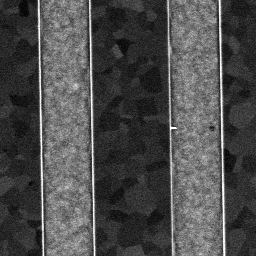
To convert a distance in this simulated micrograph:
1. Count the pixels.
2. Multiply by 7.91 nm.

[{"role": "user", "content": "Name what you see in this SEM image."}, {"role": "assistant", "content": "one or a few lines or trenches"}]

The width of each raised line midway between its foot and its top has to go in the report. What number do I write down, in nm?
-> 620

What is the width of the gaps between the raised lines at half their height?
406 nm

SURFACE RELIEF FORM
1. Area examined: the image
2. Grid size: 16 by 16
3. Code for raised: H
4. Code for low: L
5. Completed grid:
HHLLLLHHHHLLLLHH
HHLLLLHHHHHLLLHH
HHLLLLHHHHHLLLHH
HHLLLLHHHHHLLLHH
HHHLLLHHHHHLLLHH
HHHLLLHHHHHLLLHH
HHHLLLHHHHHLLLHH
HHHLLLHHHHHLLLHH
HHHLLLHHHHHLLLHH
HHHLLLHHHHHLLLHH
HHHLLLHHHHHLLLHH
HHHLLLHHHHHLLLHH
HHHLLLHHHHHLLLHH
HHHLLLHHHHHLLLHH
HHHLLLHHHHHLLLHH
HHHLLLHHHHHLLLHH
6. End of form